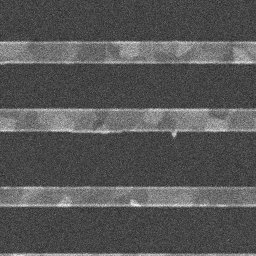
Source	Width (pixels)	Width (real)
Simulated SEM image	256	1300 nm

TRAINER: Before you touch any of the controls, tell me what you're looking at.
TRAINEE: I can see one or a few lines or trenches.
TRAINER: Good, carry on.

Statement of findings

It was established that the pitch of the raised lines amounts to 368 nm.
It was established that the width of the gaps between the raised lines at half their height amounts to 245 nm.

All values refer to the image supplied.